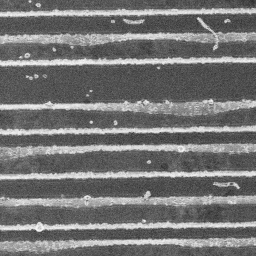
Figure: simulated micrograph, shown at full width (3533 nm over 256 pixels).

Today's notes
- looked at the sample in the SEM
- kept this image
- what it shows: lines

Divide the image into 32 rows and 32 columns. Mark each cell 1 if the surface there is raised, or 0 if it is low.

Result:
11111111111111111111111111111111
11111111111111111111111000000000
00000000000000000000000000000000
00000000000000000000000000000000
00000000000000000000000000000000
11111111111111111111111111111111
11111111111111111111111111111111
11111111111111111111111111111111
00000000000000000000000000000000
00000000000000000000000000000000
00000000000000000000000000000000
00000000000000000000000000000000
00000000000000000000000000000000
11111111111111111111110111111111
11111111111111111111111111111111
11111111111111111111111111111111
11110110000000000000000000000000
00000000000000000000000000000000
00000000000011111111111111100011
11111111111111111111111111111111
11111111111111111111111111111111
11111111111111111111111111111111
00000000000000000000000000000000
00000000000000000000000000000000
00000000000000000000000000000000
11111111111111111111111111111111
11111111111111111111111111111111
11111111111111111111111111111111
10001100000000000000000000000000
00000000000000000000000000000000
00000000111111111111111111111111
11111111111111111111111111111111